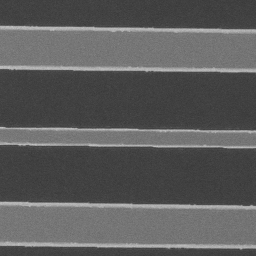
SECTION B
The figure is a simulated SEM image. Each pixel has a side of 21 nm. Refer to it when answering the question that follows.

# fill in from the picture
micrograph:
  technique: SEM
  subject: lines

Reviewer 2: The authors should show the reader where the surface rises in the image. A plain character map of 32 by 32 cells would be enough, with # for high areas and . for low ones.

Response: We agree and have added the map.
................................
................................
................................
#...............................
################################
################################
################################
################################
.....###########################
................................
................................
................................
................................
................................
................................
................................
################################
################################
................................
................................
................................
................................
................................
................................
................................
#...............................
################################
################################
################################
################################
################################
................................